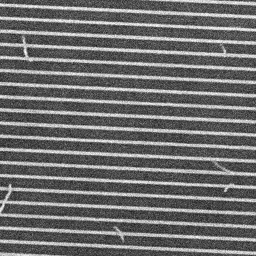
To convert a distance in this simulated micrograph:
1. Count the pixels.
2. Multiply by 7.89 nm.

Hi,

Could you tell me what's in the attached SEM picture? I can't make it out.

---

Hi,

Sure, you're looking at parallel lines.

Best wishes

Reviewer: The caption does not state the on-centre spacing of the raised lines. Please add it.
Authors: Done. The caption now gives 103 nm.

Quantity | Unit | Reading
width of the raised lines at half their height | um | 0.0227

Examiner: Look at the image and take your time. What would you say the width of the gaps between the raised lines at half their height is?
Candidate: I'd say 10.6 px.